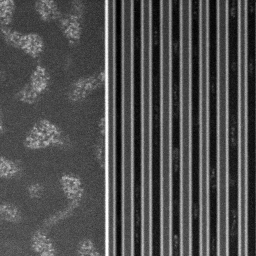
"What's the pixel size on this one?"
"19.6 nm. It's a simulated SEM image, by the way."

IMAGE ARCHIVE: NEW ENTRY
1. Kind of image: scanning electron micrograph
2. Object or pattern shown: parallel lines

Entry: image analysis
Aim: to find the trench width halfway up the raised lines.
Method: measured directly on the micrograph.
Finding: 194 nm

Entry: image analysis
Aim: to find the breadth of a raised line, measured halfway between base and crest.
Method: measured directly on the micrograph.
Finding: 174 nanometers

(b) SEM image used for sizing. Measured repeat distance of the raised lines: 0.37 microns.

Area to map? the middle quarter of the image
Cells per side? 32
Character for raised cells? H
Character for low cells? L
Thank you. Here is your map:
LLLLLLLLLLLHHLLHHLLLHHLLHHHLLHHL
LLLLLLLLLLLHHLLHHLLLHHLLHHHLLHHL
LLLLLLLLLLLHHLLHHLLLHHLLHHHLLHHL
LLLLLLLLLLLHHLLHHLLLHHLLHHHLLHHL
LLLLLLLLLLLHHLLHHLLLHHLLHHHLLHHL
LLLLLLLLLLLHHLLHHLLLHHLLHHHLLHHL
LLLLLLLLLLLHHLLHHLLLHHLLHHHLLHHL
LLLLLLLLLLLHHLLHHLLLHHLLHHHLLHHL
LLLLLLLLLLLHHLLHHLLLHHLLHHHLLHHL
LLLLLLLLLLLHHLLHHLLLHHLLHHHLLHHL
LLLLLLLLLLLHHLLHHLLLHHLLHHHLLHHL
LLLLLLLLLLLHHLLHHLLLHHLLHHHLLHHL
LLLLLLLLLLLHHLLHHLLLHHLLHHHLLHHL
LLLLLLLLLLLHHLLHHLLLHHLLHHHLLHHL
LLLLLLLLLLLHHLLHHLLLHHLLHHHLLHHL
LLLLLLLLLLLHHLLHHLLLHHLLHHHLLHHL
LLLLLLLLLLLHHLLHHLLLHHLLHHHLLHHL
LLLLLLLLLLLHHLLHHLLLHHLLHHHLLHHL
LLLLLLLLLLLHHLLHHLLLHHLLHHHLLHHL
LLLLLLLLLLLHHLLHHLLLHHLLHHHLLHHL
LLLLLLLLLLLHHLLHHLLLHHLLHHHLLHHL
LLLLLLLLLLLHHLLHHLLLHHLLHHHLLHHH
LLLLLLLLLLLHHLLHHLLLHHLLHHHLLHHH
LLLLLLLLLLLHHLLHHLLLHHLLHHHLLHHH
LLLLLLLLLLLHHLLHHLLLHHLLHHHLLHHH
LLLLLLLLLLLHHLLHHLLLHHLLHHHLLHHH
LLLLLLLLLLLHHLLHHLLLHHLLHHHLLHHH
LLLLLLLLLLLHHLLHHLLLHHLLHHHLLHHH
LLLLLLLLLLLHHLLHHLLLHHLLHHHLLHHH
LLLLLLLLLLLHHLLHHLLLHHLLHHHLLHHH
LLLLLLLLLLLHHLLHHLLLHHLLHHHLLHHH
LLLLLLLLLLLHHLLHHLLLHHLLHHHLLHHH